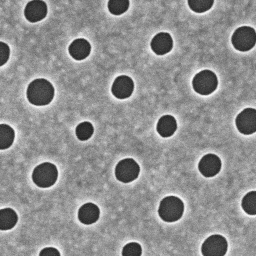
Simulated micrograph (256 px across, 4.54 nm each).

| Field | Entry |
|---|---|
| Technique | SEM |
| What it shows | a regular array of holes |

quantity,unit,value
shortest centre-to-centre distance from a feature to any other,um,0.264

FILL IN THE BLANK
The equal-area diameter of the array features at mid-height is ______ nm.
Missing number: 111